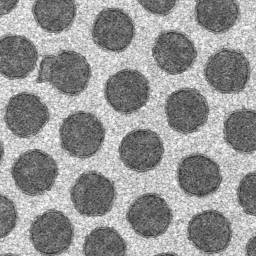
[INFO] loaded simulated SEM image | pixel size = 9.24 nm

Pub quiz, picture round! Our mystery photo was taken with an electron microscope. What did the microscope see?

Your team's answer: a regular array of raised bodies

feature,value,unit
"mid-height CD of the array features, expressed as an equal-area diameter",353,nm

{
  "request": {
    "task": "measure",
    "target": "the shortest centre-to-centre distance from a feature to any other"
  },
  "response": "533 nm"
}